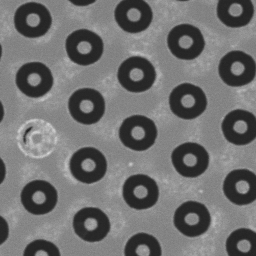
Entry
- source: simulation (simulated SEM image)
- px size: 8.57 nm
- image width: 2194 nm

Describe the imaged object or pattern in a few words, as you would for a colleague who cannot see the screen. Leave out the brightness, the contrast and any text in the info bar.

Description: a regular array of ring-shaped grooves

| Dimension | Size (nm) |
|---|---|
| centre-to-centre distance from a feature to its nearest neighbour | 500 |